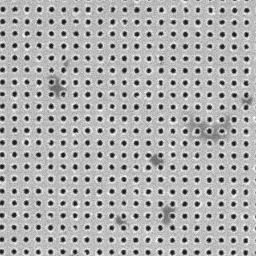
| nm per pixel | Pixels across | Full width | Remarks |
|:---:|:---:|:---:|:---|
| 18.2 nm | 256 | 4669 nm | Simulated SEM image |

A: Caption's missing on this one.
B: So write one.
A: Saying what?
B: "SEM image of a regular array of holes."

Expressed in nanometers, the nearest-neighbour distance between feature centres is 213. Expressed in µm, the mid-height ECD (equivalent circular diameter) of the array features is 0.0965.